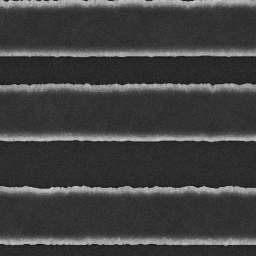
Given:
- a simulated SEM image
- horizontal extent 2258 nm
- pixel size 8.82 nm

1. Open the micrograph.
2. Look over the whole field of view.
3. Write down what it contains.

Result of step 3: lines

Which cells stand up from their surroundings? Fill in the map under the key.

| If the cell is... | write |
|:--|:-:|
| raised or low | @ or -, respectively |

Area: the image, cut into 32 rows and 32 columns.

@@@@@@@@@@@@@@@@@@@@@@@@@@@@@@@@
@@@@@@@@@@@@@@@@@@@@@@@@@@@@@@@@
@@@@@@@@@@@@@@@@@@@@@@@@@@@@@@@@
@@@@@@@@@@@@@@@@@@@@@@@@@@@@@@@@
@@@@@@@@@@@@@@@@@@@@@@@@@@@@@@@@
@@@@@@@@@@@@@@@@@@@@@@@@@@@@@@@@
@@@@@@@@@@@@@@@@@@@@@@@@@@@@@@@@
--------------------------------
--------------------------------
--------------------------------
--------------------------------
@@@@@@@@@@@@@@@@@@@@@@@@@@@@@@@@
@@@@@@@@@@@@@@@@@@@@@@@@@@@@@@@@
@@@@@@@@@@@@@@@@@@@@@@@@@@@@@@@@
@@@@@@@@@@@@@@@@@@@@@@@@@@@@@@@@
@@@@@@@@@@@@@@@@@@@@@@@@@@@@@@@@
@@@@@@@@@@@@@@@@@@@@@@@@@@@@@@@@
--------------------------------
--------------------------------
--------------------------------
--------------------------------
--------------------------------
--------------------------------
@--@-----@@----@---@---@----@---
@@@@@@@@@@@@@@@@@@@@@@@@@@@@@@@@
@@@@@@@@@@@@@@@@@@@@@@@@@@@@@@@@
@@@@@@@@@@@@@@@@@@@@@@@@@@@@@@@@
@@@@@@@@@@@@@@@@@@@@@@@@@@@@@@@@
@@@@@@@@@@@@@@@@@@@@@@@@@@@@@@@@
@@@@@@@@@@@@@@@@@@@@@@@@@@@@@@@@
----------------------------@---
--------------------------------